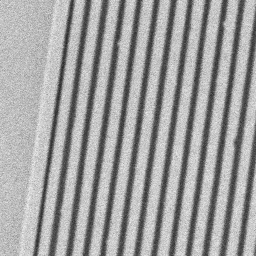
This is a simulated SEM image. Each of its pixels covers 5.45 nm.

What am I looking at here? parallel lines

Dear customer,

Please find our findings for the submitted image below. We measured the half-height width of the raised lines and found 60 nm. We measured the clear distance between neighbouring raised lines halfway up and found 32.3 nm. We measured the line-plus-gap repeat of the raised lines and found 0.0919 µm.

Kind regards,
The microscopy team